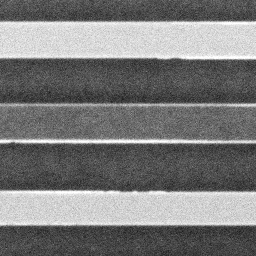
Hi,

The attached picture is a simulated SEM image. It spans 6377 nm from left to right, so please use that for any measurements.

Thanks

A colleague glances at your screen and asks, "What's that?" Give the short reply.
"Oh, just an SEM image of lines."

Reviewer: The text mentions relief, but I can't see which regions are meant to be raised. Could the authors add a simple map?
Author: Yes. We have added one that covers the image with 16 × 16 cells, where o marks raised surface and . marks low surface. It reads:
................
oooooooooooooooo
oooooooooooooooo
oooooooooooooooo
................
................
................
oooooooooooooooo
oooooooooooooooo
................
................
................
oooooooooooooooo
oooooooooooooooo
................
................